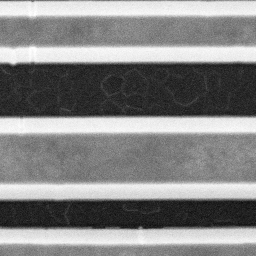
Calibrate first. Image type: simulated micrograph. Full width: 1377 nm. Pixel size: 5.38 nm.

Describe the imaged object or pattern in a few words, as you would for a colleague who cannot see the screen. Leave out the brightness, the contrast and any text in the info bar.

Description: one or a few lines or trenches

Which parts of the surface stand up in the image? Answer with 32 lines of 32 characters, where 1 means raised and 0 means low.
00000000000000000000000000000000
11111111111111111111111111111111
11111111111111111111111111111111
11111111111111111111111111111111
11111111111111111111111111111111
11111111111111111111111111111111
11111111111111111111111111111111
00000000000000000000000000000000
00000000000000000000000000000000
00000000000000000000000000000000
00000000000000000000000000000000
00000000000000000000000000000000
00000000000000000000000000000000
00000000000000000000000000000000
00000000000000000000000000000000
00000000000000000000000000000000
11111111111111111111111111111111
11111111111111111111111111111111
11111111111111111111111111111111
11111111111111111111111111111111
11111111111111111111111111111111
11111111111111111111111111111111
11111111111111111111111111111111
11111111111111111111111111111111
00000000000000000000000000000000
00000000000000000000000000000000
00000000000000000000000000000000
00000000000000000000000000000000
00000000000000000000000000000000
00000000000000000000000000111111
11111111111111111111111111111111
11111111111111111111111111111111